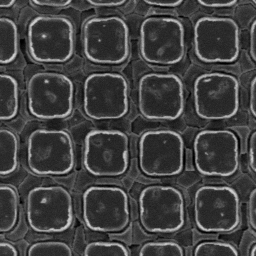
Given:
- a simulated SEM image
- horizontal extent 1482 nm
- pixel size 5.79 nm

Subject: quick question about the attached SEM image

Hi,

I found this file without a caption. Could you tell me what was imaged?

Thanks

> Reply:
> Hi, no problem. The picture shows a regular array of raised bodies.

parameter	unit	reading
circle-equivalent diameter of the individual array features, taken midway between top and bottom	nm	269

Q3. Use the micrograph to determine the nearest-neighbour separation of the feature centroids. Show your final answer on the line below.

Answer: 0.32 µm